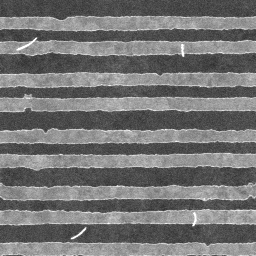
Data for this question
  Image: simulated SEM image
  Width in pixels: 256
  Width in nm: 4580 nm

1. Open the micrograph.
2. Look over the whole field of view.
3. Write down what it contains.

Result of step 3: parallel lines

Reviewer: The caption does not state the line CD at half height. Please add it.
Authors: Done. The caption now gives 206 nanometers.